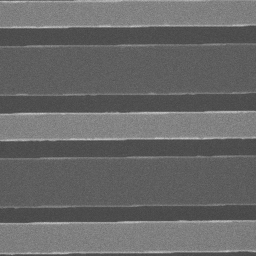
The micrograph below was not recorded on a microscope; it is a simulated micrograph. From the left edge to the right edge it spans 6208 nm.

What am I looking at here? lines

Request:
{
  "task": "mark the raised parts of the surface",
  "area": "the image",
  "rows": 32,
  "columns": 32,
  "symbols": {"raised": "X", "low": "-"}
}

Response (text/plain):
XXXXXXXXXXXXXXXXXXXXXXXXXXXXXXXX
XXXXXXXXXXXXXXXXXXXXXXXXXXXXXXXX
XXXXXXXXXXXXXXXXXXXXXXXXXXXXXXXX
--------------------------------
--------------------------------
--------------------------------
XXXXXXXXXXXXXXXXXXXXXXXXXXXXXXXX
XXXXXXXXXXXXXXXXXXXXXXXXXXXXXXXX
XXXXXXXXXXXXXXXXXXXXXXXXXXXXXXXX
XXXXXXXXXXXXXXXXXXXXXXXXXXXXXXXX
XXXXXXXXXXXXXXXXXXXXXXXXXXXXXXXX
XXXXXXXXXXXXXXXXXXXXXXXXXXXXXXXX
--------------------------------
--------------------------------
XXXXXXXXXXXXXXXXXXXXXXXXXXXXXXXX
XXXXXXXXXXXXXXXXXXXXXXXXXXXXXXXX
XXXXXXXXXXXXXXXXXXXXXXXXXXXXXXXX
XXXXXXX-------------------------
--------------------------------
--------------------------------
XXXXXXXXXXXXXXXXXXXXXXXXXXXXXXXX
XXXXXXXXXXXXXXXXXXXXXXXXXXXXXXXX
XXXXXXXXXXXXXXXXXXXXXXXXXXXXXXXX
XXXXXXXXXXXXXXXXXXXXXXXXXXXXXXXX
XXXXXXXXXXXXXXXXXXXXXXXXXXXXXXXX
XXXXXXXXXXXXXXXXXXXXXXXXXXXXXXXX
--------------------------------
--------------------------------
XXXXXXXXXXXXXXXXXXXXXXXXXXXXXXXX
XXXXXXXXXXXXXXXXXXXXXXXXXXXXXXXX
XXXXXXXXXXXXXXXXXXXXXXXXXXXXXXXX
XXXXXXXXXXXXXXXXXXXXXX----------